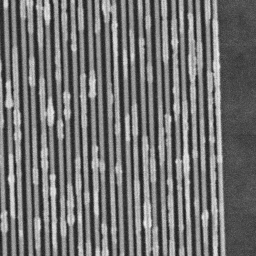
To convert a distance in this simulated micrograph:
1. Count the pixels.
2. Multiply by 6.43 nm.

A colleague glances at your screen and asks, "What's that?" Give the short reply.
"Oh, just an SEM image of parallel lines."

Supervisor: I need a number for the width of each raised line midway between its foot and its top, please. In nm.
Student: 28.1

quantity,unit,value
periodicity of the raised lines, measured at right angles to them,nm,53.6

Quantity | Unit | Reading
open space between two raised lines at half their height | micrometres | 0.0225